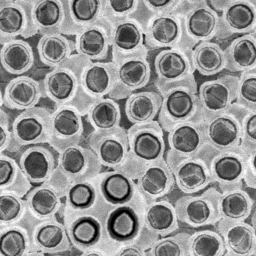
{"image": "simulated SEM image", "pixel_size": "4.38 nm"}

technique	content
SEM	a regular array of holes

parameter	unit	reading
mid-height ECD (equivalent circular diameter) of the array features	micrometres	0.111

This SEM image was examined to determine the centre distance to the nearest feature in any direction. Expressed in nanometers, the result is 151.